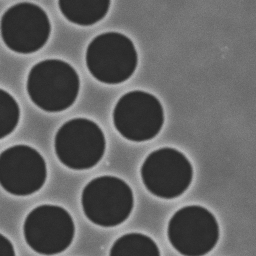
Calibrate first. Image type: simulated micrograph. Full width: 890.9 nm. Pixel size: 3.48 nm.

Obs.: a regular array of holes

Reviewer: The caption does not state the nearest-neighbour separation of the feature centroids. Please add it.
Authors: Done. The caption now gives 222 nm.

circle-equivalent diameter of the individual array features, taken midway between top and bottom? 176 nanometers